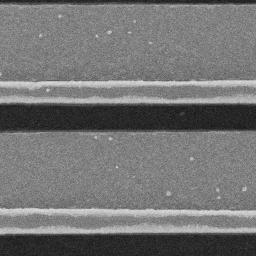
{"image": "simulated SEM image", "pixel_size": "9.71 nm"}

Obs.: lines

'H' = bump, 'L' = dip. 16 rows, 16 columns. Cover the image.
HHHHHHHHHHHHHHHH
HHHHHHHHHHHHHHHH
HHHHHHHHHHHHHHHH
HHHHHHHHHHHHHHHH
HHHHHHHHHHHHHHHH
HHHHHHHHHHHHHHHH
LLLLLLLLLLLLLLLL
LLLLLLLLLLLLLLLL
HHHHHHHHHHHHHHHH
HHHHHHHHHHHHHHHH
HHHHHHHHHHHHHHHH
HHHHHHHHHHHHHHHH
HHHHHHHHHHHHHHHH
HHHHHHHHHHHHHHHH
HHHHHHHHHHHHHHHH
LLLLLLLLLLLLLLLL